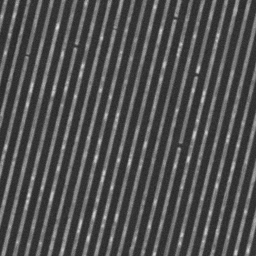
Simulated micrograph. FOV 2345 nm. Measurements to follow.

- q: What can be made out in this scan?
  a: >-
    parallel lines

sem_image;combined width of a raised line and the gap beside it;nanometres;103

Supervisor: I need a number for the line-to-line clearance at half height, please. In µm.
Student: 0.0791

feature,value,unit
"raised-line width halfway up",23.4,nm